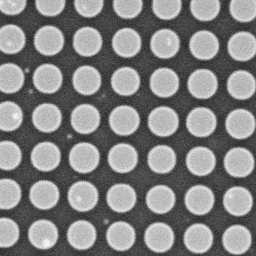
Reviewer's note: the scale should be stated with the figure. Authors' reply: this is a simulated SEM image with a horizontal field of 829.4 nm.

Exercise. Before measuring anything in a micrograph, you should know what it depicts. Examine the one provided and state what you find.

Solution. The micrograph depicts an array of small figures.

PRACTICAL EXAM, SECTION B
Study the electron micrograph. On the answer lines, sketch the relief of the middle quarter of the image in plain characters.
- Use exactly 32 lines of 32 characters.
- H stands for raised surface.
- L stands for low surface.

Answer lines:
LLLLLLLLLLLLLLLLLLLLLLLLLLLLLLLL
LLLHHHHHLLLLLLHHHLLLLLLHHHLLLLLL
LLLHHHHHHLLLHHHHHHLLLLHHHHHHLLLL
LLHHHHHHHLLLHHHHHHHLLLHHHHHHLLLH
LLHHHHHHHLLLHHHHHHHLLLHHHHHHLLLH
LLLHHHHHHLLLHHHHHHHLLLHHHHHHLLLH
LLLHHHHHLLLLLHHHHHLLLLHHHHHHLLLH
LLLLLHLLLLLLLLHHHLLLLLLHHHHLLLLL
LLLLLLLLLLLLLLLLLLLLLLLLLLLLLLLL
LLLLLLLLLLLLLLLLLLLLLLLLLLLLLLLL
LLLLHHHLLLLLLLLLLLLLLLLLLLLLLLLL
LLLHHHHHLLLLLHHHHHLLLLLHHHHLLLLL
LLHHHHHHHLLLHHHHHHLLLLHHHHHHLLLH
LLHHHHHHHLLLHHHHHHHLLHHHHHHHLLLH
LLHHHHHHHLLLHHHHHHHLLHHHHHHHLLLH
LLHHHHHHLLLLHHHHHHLLLHHHHHHHLLLH
LLLHHHHHLLLLHHHHHHLLLLHHHHHHLLLH
LLLLLLLLLLLLLLHHLLLLLLLHHHHLLLLL
LLLLLLLLLLLLLLLLLLLLLLLLLLLLLLLL
LLLLLLLLLLLLLLLLLLLLLLLLLLLLLLLL
LLLHHHHLLLLLLHHHLLLLLLLLLLLLLLLL
LLHHHHHHLLLLHHHHHHLLLLHHHHHLLLLL
LHHHHHHHHLLHHHHHHHLLLHHHHHHHLLLH
LHHHHHHHHLLHHHHHHHLLLHHHHHHHLLLH
LLHHHHHHHLLHHHHHHHLLLHHHHHHHLLLH
LLHHHHHHLLLLHHHHHHLLLLHHHHHLLLLH
LLLHHHHLLLLLLHHHHLLLLLHHHHLLLLLH
LLLLLLLLLLLLLLLLLLLLLLLLLLLLLLLL
LLLLLLLLLLLLLLLLLLLLLLLLLLLLLLLL
LLLLLLLLLLLLLLLLLLLLLLLLLLLLLLLL
LLHHHHHLLLLLLHHHLLLLLLLLLLLLLLLL
LHHHHHHHLLLHHHHHHLLLLLHHHHHLLLLH